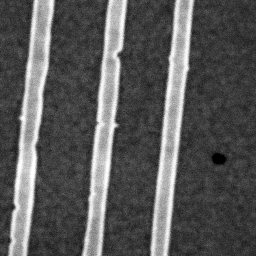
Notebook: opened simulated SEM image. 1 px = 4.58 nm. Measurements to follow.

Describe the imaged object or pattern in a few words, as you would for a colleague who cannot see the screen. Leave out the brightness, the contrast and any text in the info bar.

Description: one or a few lines or trenches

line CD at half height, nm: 66.6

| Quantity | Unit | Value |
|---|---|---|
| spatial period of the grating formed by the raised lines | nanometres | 321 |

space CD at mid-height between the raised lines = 0.255 microns